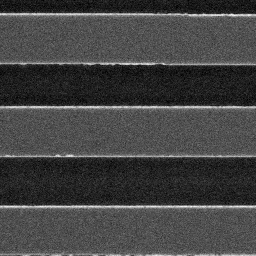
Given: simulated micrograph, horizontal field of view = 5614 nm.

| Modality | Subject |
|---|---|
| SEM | lines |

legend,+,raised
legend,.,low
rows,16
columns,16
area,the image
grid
................
++++++++++++++++
++++++++++++++++
++++++++++++++++
................
................
................
++++++++++++++++
++++++++++++++++
++++++++++++++++
................
................
................
++++++++++++++++
++++++++++++++++
++++++++++++++++